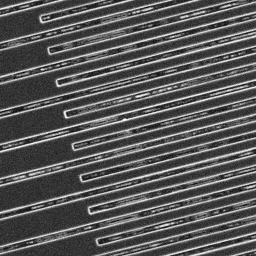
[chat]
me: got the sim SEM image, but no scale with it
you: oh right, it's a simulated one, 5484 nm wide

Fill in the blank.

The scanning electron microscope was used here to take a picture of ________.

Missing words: parallel lines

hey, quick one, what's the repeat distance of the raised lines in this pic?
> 352 nm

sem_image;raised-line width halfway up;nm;213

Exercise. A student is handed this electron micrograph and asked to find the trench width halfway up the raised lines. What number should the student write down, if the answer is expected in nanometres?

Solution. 135